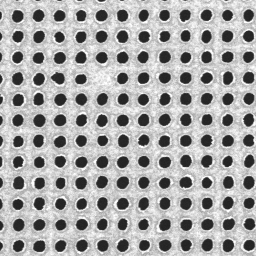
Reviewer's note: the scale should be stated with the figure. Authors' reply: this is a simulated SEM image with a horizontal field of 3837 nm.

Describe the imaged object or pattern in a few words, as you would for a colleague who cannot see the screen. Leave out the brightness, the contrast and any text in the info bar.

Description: a regular array of holes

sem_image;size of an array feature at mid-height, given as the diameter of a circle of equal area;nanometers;181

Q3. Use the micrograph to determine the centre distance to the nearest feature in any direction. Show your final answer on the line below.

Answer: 305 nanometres